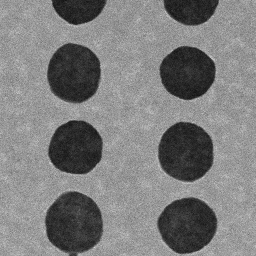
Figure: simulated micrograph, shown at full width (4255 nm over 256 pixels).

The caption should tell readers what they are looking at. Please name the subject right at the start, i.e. holes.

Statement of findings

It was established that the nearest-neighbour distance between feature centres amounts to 74.4 px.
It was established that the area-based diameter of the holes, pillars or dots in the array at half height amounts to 941 nm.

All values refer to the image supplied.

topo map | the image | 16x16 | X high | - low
XXX---XXXX----XX
XXXXXXXXXXXX-XXX
XXXXXXXXXXXXXXXX
XXX---XXXX---XXX
XXX---XXXX---XXX
XXX---XXXX---XXX
XXXXXXXXXXXXXXXX
XXXXXXXXXXXXXXXX
XXX---XXXX---XXX
XXX---XXXX---XXX
XXXX--XXXX---XXX
XXXXXXXXXXXXXXXX
XXXX--XXXXX-XXXX
XXX---XXXX---XXX
XXX---XXXX---XXX
XXXX--XXXXX--XXX